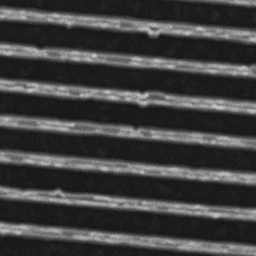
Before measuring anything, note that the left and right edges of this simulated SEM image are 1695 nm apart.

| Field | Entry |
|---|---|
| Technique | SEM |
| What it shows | parallel lines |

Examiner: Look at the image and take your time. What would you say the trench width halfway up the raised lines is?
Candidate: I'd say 156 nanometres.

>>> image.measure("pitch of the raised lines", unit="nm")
236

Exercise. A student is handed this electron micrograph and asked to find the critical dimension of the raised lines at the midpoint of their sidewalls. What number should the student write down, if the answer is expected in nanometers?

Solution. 77.5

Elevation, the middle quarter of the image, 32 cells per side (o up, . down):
..............oooooooooooooooooo
............................oooo
................................
................................
................................
oo..............................
ooooooooooooo...................
oooooooooooooooooooooooooo......
..oooooooooooooooooooooooooooooo
................oooooooooooooooo
...................o......oooooo
................................
................................
................................
o.oo............................
oooooooooooooooo................
oooooooooooooooooooooooooo......
.....o.ooooooooooooooooooooooooo
...............o..oooooooooooooo
............................oooo
................................
................................
................................
ooo.............................
ooooooooooooooo.................
ooooooooooooooooooooooooo.......
.....ooooooooooooooooooooooooooo
.................ooooooooooooooo
............................oooo
................................
................................
................................